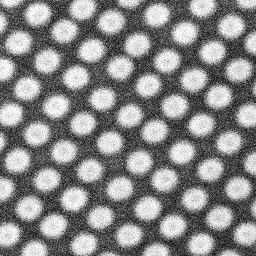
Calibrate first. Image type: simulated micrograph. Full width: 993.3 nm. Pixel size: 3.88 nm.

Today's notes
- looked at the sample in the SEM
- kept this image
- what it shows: a regular array of raised bodies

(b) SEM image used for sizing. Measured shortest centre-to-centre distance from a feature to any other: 0.123 microns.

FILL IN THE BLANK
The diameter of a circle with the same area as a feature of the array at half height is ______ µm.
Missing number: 0.0802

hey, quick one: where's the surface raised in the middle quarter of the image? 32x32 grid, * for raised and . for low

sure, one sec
............*****......*****....
..***......******.......***.....
.*****......****...............*
******..............***.......**
*****..............*****......**
.***..............******......**
.........*.........****.........
........****........**..........
.......*****...............**...
*......*****.............*****..
*.......***..............*****..
...............****......*****..
..............*****.......***...
...****.......*****.............
..*****.......****..............
..*****..............****.......
...****.............*****.......
...........*........*****.......
.........*****......****........
.........*****..................
**.......*****..............****
***.......***..............*****
***...............**.......*****
**...............****......****.
......**........******......**..
.....****.......*****...........
....*****........***............
....*****..............*****....
.....***...............*****....
............****.......*****....
............*****......****.....
..**.......******...............